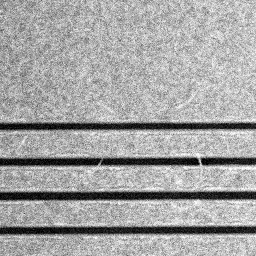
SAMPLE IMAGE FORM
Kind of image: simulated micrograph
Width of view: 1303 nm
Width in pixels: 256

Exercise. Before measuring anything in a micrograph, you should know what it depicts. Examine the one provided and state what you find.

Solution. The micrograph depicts parallel lines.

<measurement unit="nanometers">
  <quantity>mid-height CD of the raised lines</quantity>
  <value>125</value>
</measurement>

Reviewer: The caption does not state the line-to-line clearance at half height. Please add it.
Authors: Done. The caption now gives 0.0483 um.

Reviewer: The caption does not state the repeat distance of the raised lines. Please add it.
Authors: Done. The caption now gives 34.6 pixels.